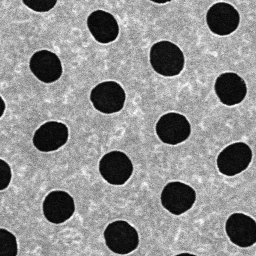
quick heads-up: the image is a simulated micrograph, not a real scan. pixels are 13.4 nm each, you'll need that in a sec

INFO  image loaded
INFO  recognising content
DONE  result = a regular array of holes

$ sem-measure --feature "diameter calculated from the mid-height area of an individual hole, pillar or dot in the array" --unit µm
0.449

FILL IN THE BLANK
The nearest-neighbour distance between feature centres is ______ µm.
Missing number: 0.93